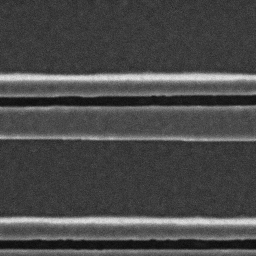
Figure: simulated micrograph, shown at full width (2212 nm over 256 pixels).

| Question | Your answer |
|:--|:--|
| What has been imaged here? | lines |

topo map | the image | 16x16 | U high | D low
DDDDDDDDDDDDDDDD
DDDDDDDDDDDDDDDD
DDDDDDDDDDDDDDDD
DDDDDDDDDDDDDDDD
DDDDDDDDDDDDDDDD
UUUUUUUUUUUUUUUU
UUUUUUUUUUUUUUUU
UUUUUUUUUUUUUUUU
UUUUUUUUUUUUUUUU
DDDDDDDDDDDDDDDD
DDDDDDDDDDDDDDDD
DDDDDDDDDDDDDDDD
DDDDDDDDDDDDDDDD
DDDDDDDDDDDDDDDD
UUUUUUUUUUUUUUUU
UUUUUUUUUUUUUUUU